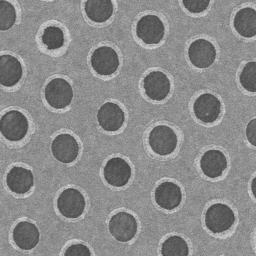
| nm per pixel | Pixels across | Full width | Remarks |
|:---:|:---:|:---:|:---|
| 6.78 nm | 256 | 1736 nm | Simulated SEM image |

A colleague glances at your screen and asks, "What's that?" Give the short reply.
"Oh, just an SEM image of a regular array of holes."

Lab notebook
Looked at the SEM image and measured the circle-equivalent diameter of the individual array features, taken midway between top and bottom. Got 196 nm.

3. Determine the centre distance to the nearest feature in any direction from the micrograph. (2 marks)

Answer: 0.373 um